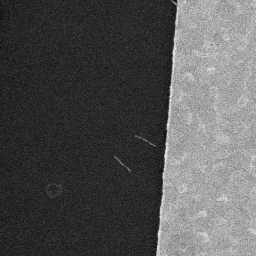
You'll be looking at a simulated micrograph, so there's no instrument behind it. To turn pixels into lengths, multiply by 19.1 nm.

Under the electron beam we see one or a few lines or trenches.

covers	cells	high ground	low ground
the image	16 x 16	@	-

-----------@@@@@
-----------@@@@@
-----------@@@@@
-----------@@@@@
-----------@@@@@
-----------@@@@@
-----------@@@@@
-----------@@@@@
----------@@@@@@
----------@@@@@@
----------@@@@@@
----------@@@@@@
----------@@@@@@
----------@@@@@@
----------@@@@@@
----------@@@@@@